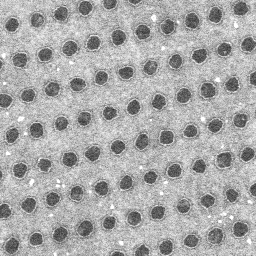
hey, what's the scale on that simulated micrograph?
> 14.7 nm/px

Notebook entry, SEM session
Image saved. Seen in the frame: a regular array of raised bodies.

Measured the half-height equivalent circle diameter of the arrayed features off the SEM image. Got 226 nanometres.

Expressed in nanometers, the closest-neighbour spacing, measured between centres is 364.